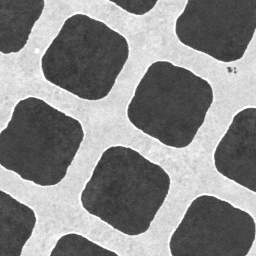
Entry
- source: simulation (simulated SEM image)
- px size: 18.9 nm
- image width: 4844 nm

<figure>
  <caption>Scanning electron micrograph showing holes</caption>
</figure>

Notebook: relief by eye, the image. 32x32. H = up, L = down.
LLLLLLHHHHHHHHLLLLLLHHHLLLLLLLLL
LLLLLHHHHHHHHHHHLLLHHHHLLLLLLLLL
LLLLLHHHLLLLHHHHHHHHHHLLLLLLLLLL
LLLLHHHHLLLLLLHHHHHHHHLLLLLLLLLL
LLLLHHHLLLLLLLLHHHHHHHLLLLLLLLLL
LLLHHHLLLLLLLLLLHHHHHHHLLLLLLLLH
LLHHHHLLLLLLLLLLHHHHHHHHHLLLLLLH
HHHHHLLLLLLLLLLLHHHHHHHHHHHLLLHH
HHHHHLLLLLLLLLLHHHHLLLLHHHHHLLHH
HHHHHLLLLLLLLLLHHHLLLLLLLHHHLHHH
HHHHHHHLLLLLLLHHHLLLLLLLLLHHHHHH
HHHHHHHHHLLLLLHHHLLLLLLLLLLHHHHH
HHHLLHHHHHHLHHHHLLLLLLLLLLLHHHHH
HHLLLLLHHHHHHHHHLLLLLLLLLLHHHHHL
HLLLLLLLLHHHHHHHLLLLLLLLLLHHHLLL
HLLLLLLLLLHHHHHHLLLLLLLLLHHHHLLL
LLLLLLLLLLHHHHHHHHLLLLLLLHHHLLLL
LLLLLLLLLLHHHHHHHHHHLLLLHHHHLLLL
LLLLLLLLLLHHHHLLHHHHHHLHHHHLLLLL
LLLLLLLLLHHHHLLLLLHHHHHHHHHLLLLL
LLLLLLLLLHHHLLLLLLLLHHHHHHHLLLLL
HHLLLLLLHHHHLLLLLLLLLHHHHHHLLLLL
HHHLLLLLHHHLLLLLLLLLLHHHHHHHHLLL
HHHHHHHHHHLLLLLLLLLLLHHHHHHHHHHL
LHHHHHHHHHLLLLLLLLLLLHHHHLLHHHHH
LLLHHHHHHHLLLLLLLLLLHHHHLLLLLHHH
LLLLHHHHHHHLLLLLLLLLHHHLLLLLLLLH
LLLLLHHHHHHHHLLLLLLHHHHLLLLLLLLL
LLLLHHHHHHHHHHLLLLLHHHLLLLLLLLLL
LLLLHHHHLLHHHHHHLHHHHLLLLLLLLLLL
LLLHHHHLLLLLHHHHHHHHHLLLLLLLLLLL
LLLHHHLLLLLLLLHHHHHHHLLLLLLLLLLH